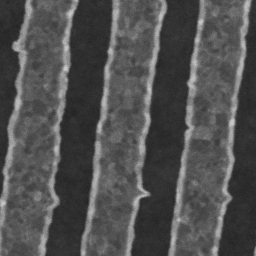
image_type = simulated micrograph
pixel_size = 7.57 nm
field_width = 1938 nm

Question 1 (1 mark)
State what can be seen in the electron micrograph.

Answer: one or a few lines or trenches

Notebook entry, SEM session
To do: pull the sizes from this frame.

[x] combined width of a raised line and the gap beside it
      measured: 0.656 micrometres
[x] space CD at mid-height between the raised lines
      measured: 318 nm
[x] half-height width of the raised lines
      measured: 336 nm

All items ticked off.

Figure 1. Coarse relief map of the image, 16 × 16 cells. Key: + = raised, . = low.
..+++..+++...++.
..++...+++...++.
.+++...+++..+++.
.+++...+++..+++.
.+++...++...+++.
.+++...++...+++.
.+++...++...+++.
.+++..+++...+++.
.+++..+++...++..
.+++..+++...++..
+++...+++..+++..
+++...+++..+++..
+++...+++..+++..
+++...++...+++..
+++..+++...+++..
+++..+++...++...